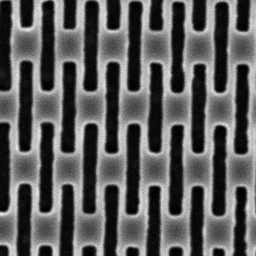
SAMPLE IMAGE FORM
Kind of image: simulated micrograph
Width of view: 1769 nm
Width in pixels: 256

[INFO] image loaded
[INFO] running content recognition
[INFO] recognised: a regular array of holes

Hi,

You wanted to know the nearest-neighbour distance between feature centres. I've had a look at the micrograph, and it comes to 299 nm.